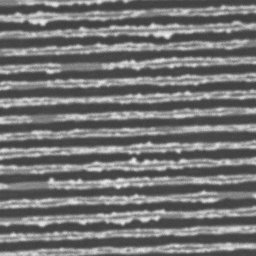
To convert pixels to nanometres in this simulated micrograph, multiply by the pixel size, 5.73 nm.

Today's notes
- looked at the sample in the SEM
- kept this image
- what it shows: parallel lines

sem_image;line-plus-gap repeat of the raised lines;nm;96.6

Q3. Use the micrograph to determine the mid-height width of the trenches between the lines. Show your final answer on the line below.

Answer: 52.9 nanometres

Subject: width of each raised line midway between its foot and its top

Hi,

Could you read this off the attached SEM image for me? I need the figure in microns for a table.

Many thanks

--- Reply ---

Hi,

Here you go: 0.0422